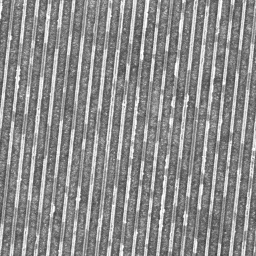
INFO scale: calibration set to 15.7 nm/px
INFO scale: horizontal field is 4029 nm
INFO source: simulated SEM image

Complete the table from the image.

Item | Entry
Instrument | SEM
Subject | parallel lines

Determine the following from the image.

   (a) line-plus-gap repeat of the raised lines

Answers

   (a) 191 nanometers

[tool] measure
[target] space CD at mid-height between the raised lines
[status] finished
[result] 151 nm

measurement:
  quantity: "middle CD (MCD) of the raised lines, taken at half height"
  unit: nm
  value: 41.1